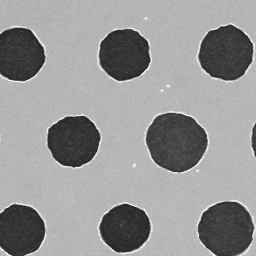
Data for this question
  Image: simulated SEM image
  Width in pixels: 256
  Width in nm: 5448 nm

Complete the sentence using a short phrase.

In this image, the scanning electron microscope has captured holes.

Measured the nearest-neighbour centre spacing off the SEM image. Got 2.14 micrometres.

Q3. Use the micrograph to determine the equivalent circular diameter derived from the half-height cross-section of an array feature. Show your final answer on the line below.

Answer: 1110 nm